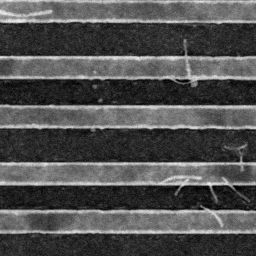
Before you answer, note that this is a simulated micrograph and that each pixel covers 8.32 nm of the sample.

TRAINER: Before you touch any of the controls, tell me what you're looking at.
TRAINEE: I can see lines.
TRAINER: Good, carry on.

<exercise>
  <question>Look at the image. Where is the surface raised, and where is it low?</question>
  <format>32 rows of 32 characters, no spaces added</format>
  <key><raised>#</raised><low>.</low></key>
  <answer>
################################
################################
################################
................................
................................
................................
................................
################################
################################
################################
................................
................................
................................
################################
################################
################################
................................
................................
................................
................................
################################
################################
################################
................................
................................
................................
################################
################################
################################
................................
................................
................................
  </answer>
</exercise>